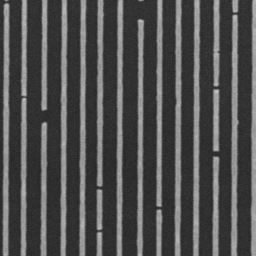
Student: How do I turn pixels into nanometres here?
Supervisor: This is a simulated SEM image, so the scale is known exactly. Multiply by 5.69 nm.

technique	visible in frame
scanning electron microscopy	parallel lines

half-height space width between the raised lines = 0.0804 µm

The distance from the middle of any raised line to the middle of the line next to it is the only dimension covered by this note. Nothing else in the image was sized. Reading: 108 nm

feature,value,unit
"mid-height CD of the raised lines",29.2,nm